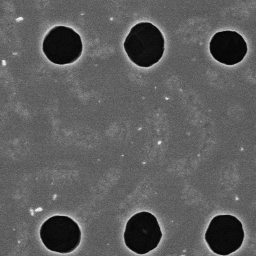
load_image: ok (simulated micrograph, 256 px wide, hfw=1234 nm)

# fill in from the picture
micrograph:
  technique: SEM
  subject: holes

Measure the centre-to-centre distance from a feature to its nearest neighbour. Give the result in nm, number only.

396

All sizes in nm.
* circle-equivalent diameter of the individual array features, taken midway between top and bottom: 188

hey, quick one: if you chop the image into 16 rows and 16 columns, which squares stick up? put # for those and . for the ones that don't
################
################
###..###..###..#
###..###..###..#
################
################
################
################
################
################
################
################
################
########..######
###..###..###..#
###..###..###..#